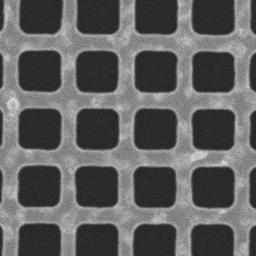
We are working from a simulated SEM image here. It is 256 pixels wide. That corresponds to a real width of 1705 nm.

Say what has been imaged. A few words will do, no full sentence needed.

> a regular array of holes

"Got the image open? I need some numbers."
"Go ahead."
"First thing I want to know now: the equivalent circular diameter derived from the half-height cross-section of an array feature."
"312 nm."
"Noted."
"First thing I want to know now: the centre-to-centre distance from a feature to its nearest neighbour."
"382 nm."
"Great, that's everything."